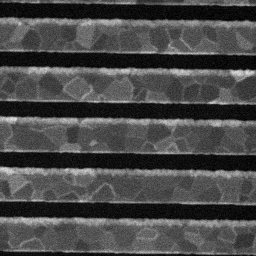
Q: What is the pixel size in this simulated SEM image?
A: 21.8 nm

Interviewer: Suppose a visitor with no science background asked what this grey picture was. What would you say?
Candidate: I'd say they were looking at lines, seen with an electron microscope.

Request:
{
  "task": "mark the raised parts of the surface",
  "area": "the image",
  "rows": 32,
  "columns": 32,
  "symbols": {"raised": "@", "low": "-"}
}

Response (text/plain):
------------------@@@@@@@@@@@@@@
--------------------------------
@@@@@@@@@@@@@-@-----------------
@@@@@@@@@@@@@@@@@@@@@@@@@@@@@@@@
@@@@@@@@@@@@@@@@@@@@@@@@@@@@@@@@
@@@@@@@@@@@@@@@@@@@@@@@@@@@@@@@@
--------------@@@@@@@@@@@@@@@@@@
--------------------------------
@@--@---------------------------
@@@@@@@@@@@@@@@@@@@@@@@@@@@@@@@@
@@@@@@@@@@@@@@@@@@@@@@@@@@@@@@@@
@@@@@@@@@@@@@@@@@@@@@@@@@@@@@@@@
@@@@@@@@@@@@@@@@@@@@@@@@@@@@@@@@
--------------------------------
--------------------------------
@@@@@@@@@@@@@@@@@@@@@@@@@@@@@@@@
@@@@@@@@@@@@@@@@@@@@@@@@@@@@@@@@
@@@@@@@@@@@@@@@@@@@@@@@@@@@@@@@@
@@@@@@@@@@@@@@@@@@@@@@@@@@@@@@@@
--------------------------------
--------------------------------
@@@@@@@@@@@@@@@@@@@@@@@@@@@@@@@-
@@@@@@@@@@@@@@@@@@@@@@@@@@@@@@@@
@@@@@@@@@@@@@@@@@@@@@@@@@@@@@@@@
@@@@@@@@@@@@@@@@@@@@@@@@@@@@@@@@
-----------------------------@@@
--------------------------------
@@@@@@@@@@@@@@@@@@@@@@@@--------
@@@@@@@@@@@@@@@@@@@@@@@@@@@@@@@@
@@@@@@@@@@@@@@@@@@@@@@@@@@@@@@@@
@@@@@@@@@@@@@@@@@@@@@@@@@@@@@@@@
--------------@-@@@@@@@@@@@@@@@@